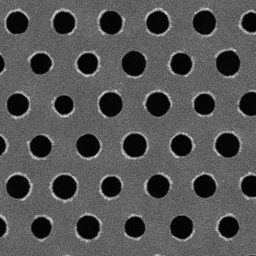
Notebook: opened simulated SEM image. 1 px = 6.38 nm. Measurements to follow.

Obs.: a regular array of holes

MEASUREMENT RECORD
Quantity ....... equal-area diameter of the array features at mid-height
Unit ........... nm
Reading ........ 144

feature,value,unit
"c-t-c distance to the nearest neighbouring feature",296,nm